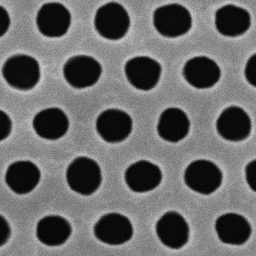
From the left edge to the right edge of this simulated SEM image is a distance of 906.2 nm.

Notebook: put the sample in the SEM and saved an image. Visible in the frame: a regular array of holes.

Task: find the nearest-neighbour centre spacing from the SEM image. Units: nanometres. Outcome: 209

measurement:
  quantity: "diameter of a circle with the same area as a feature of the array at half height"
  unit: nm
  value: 123